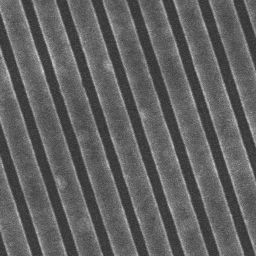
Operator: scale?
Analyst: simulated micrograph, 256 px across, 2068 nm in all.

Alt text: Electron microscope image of parallel lines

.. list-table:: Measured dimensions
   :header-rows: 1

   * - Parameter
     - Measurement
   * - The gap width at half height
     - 0.0951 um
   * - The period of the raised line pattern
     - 272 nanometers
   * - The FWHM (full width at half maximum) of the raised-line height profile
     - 176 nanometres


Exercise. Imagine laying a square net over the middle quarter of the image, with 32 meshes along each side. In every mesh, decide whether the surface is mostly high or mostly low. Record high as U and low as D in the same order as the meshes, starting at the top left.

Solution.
UUUDDDUUUUUUDDDUUUUUUDDDUUUUUUDD
UUUUDDUUUUUUDDDUUUUUUDDDUUUUUUDD
UUUUDDDUUUUUUDDDUUUUUDDDDUUUUUDD
UUUUDDDUUUUUUDDDUUUUUUDDDUUUUUUD
UUUUDDDUUUUUUDDDUUUUUUDDDUUUUUUD
UUUUUDDDUUUUUUDDDUUUUUDDDDUUUUUD
UUUUUDDDUUUUUUDDDUUUUUUDDDUUUUUU
UUUUUDDDUUUUUUDDDUUUUUUDDDUUUUUU
UUUUUUDDDUUUUUUDDDUUUUUDDDDUUUUU
UUUUUUDDDUUUUUUDDDUUUUUUDDDUUUUU
DUUUUUDDDUUUUUUDDDUUUUUUDDDUUUUU
DUUUUUUDDDUUUUUUDDDUUUUUDDDUUUUU
DUUUUUUDDDUUUUUUDDDUUUUUDDDDUUUU
DDUUUUUDDDUUUUUUDDDUUUUUUDDDUUUU
DDUUUUUUDDDUUUUUUDDDUUUUUDDDUUUU
DDUUUUUUDDDUUUUUUDDDUUUUUUDDDUUU
DDDUUUUUDDDUUUUUUDDDUUUUUUDDDUUU
DDDUUUUUUDDDUUUUUDDDUUUUUUDDDUUU
DDDUUUUUUDDDUUUUUUDDDUUUUUUDDDUU
DDDDUUUUUDDDUUUUUUDDDUUUUUUDDDUU
UDDDUUUUUUDDDUUUUUDDDDUUUUUDDDUU
UDDDUUUUUUDDDUUUUUUDDDUUUUUUDDDU
UDDDDUUUUUDDDUUUUUUDDDUUUUUUDDDU
UUDDDUUUUUUDDDUUUUUDDDUUUUUUDDDU
UUDDDUUUUUUDDDUUUUUUDDDUUUUUUDDD
UUDDDDUUUUUDDDUUUUUUDDDUUUUUUDDD
UUUDDDUUUUUUDDDUUUUUDDDUUUUUUDDD
UUUDDDUUUUUUDDDUUUUUUDDDUUUUUUDD
UUUDDDUUUUUUDDDUUUUUUDDDUUUUUUDD
UUUUDDDUUUUUUDDUUUUUUDDDUUUUUUDD
UUUUDDDUUUUUUDDDUUUUUUDDDUUUUUUD
UUUUDDDUUUUUUDDDUUUUUUDDDUUUUUUD